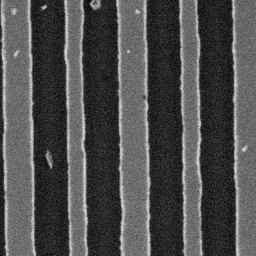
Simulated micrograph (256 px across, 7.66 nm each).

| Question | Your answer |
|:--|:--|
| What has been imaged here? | lines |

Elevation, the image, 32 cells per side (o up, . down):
oooo....oo.....ooo.....oo....ooo
oooo....oo.....ooo.....oo....ooo
oooo....oo.....ooo.....oo....ooo
oooo....oo.....ooo.....oo....ooo
oooo....oo.....ooo.....oo....ooo
oooo....oo.....ooo.....oo....ooo
oooo....oo.....ooo.....oo....ooo
oooo....oo.....ooo.....oo....ooo
oooo....oo.....ooo.....oo....ooo
oooo....oo.....ooo.....oo....ooo
oooo....oo.....ooo.....oo....ooo
oooo....oo.....ooo.....oo....ooo
oooo....oo.....ooo.....oo....ooo
oooo....oo.....ooo.....oo....ooo
oooo....ooo....ooo.....oo....ooo
.ooo....ooo....ooo.....oo....ooo
oooo....ooo....ooo.....oo....ooo
oooo....ooo....ooo.....oo....ooo
oooo....ooo....ooo.....oo....ooo
oooo....ooo....oooo....oo....ooo
.ooo....ooo....oooo....oo....ooo
.ooo.....oo....oooo....oo....ooo
.ooo.....oo....oooo....oo....ooo
.ooo.....oo....oooo....oo....ooo
.ooo.....oo....oooo....oo.....oo
.ooo.....oo....oooo....oo.....oo
.ooo.....oo....oooo....oo.....oo
.ooo.....oo....oooo....oo.....oo
.ooo.....oo....oooo....oo.....oo
.ooo.....oo....oooo....oo.....oo
.ooo.....oo....oooo....oo.....oo
.ooo.....oo....oooo....oo.....oo